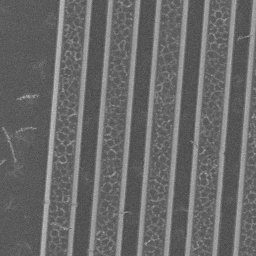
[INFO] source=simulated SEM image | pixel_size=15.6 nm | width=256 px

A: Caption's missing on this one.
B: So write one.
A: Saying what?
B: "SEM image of parallel lines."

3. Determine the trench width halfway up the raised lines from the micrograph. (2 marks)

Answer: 320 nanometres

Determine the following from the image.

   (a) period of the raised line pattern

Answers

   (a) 48.1 pixels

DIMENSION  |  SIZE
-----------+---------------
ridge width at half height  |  431 nm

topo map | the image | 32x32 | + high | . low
........+++...+++...+++...+++...
........+++...+++...+++...+++...
........+++...+++...+++...+++...
........+++...+++...+++...+++...
.......++++...+++...+++...+++..+
.......++++..++++..++++..++++...
.......++++..++++..++++..++++..+
.......++++..++++..++++..++++..+
.......++++..++++..++++..++++..+
.......+++...++++..+++...++++..+
.......+++...+++...+++...+++...+
.......+++...+++...+++...+++...+
.......+++...+++...+++...+++...+
.......+++...+++...+++...+++...+
.......+++...+++...+++...+++...+
.......+++...+++...+++...+++...+
.......+++...+++...+++...+++...+
......++++..++++...+++..++++...+
......++++..++++..++++..++++..++
......++++..++++..++++..++++..++
......++++..++++..++++..++++..++
......++++..++++..++++..++++..++
......+++...++++..+++...++++..++
......+++...+++...+++...+++...++
......+++...+++...+++...+++...++
......+++...+++...+++...+++...++
......+++...+++...+++...+++...++
......+++...+++...+++...+++...++
......+++...+++...+++...+++...++
.....++++...+++...+++...+++...++
.....++++..++++...+++...+++...++
.....++++..++++..++++..++++..+++